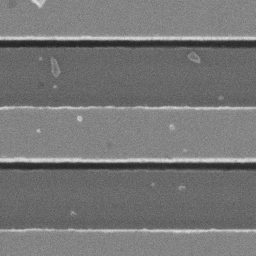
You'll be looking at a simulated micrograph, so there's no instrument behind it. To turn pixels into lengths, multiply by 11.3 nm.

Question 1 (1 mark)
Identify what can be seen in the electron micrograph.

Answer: lines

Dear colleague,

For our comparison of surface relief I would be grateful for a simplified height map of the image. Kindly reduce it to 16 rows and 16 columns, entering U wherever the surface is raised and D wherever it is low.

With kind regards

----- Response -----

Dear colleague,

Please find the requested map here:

UUUUUUUUUUUUUUUU
UUUUUUUUUUUUUUUU
DDDDDDDDDDDDDDDD
DDDDDDDDDDDDDDDD
DDDDDDDDDDDDDDDD
DDDDDDDDDDDDDDDD
DDDDDDDDDDDDDDDD
UUUUUUUUUUUUUUUU
UUUUUUUUUUUUUUUU
UUUUUUUUUUUUUUUU
DDDDDDDDDDDDDDDD
DDDDDDDDDDDDDDDD
DDDDDDDDDDDDDDDD
DDDDDDDDDDDDDDDD
UUUUUUUUUUUUUUUU
UUUUUUUUUUUUUUUU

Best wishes